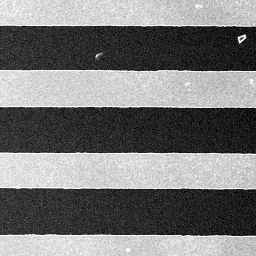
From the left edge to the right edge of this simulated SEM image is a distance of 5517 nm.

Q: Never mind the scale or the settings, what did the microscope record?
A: one or a few lines or trenches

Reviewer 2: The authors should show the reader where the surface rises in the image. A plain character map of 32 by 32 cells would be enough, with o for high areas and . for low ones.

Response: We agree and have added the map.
oooooooooooooooooooooooooooooooo
oooooooooooooooooooooooooooooooo
oooooooooooooooooooooooooooooooo
................................
................................
................................
................................
................................
................................
oooooooooooooooooooooooooooooooo
oooooooooooooooooooooooooooooooo
oooooooooooooooooooooooooooooooo
oooooooooooooooooooooooooooooooo
................................
................................
................................
................................
................................
................................
oooooooooooooooooooooooooooooooo
oooooooooooooooooooooooooooooooo
oooooooooooooooooooooooooooooooo
oooooooooooooooooooooooooooooooo
.........o....ooooooo....ooooooo
................................
................................
................................
................................
................................
ooooooooo.ooooooooooooo.........
oooooooooooooooooooooooooooooooo
oooooooooooooooooooooooooooooooo